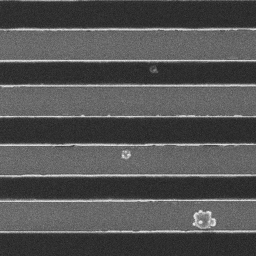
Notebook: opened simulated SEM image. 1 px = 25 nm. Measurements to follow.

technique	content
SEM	lines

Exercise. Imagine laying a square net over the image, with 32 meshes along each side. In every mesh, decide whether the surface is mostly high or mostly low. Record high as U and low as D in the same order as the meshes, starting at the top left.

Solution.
UUUUUUUUUUUUUUUUUUUUUUUUUUUUUUUU
UUUUUUUUUUUUUUUUUUUUUUUUUUUUUUUU
UUUUUUUUUUUUUUUUUUUUUUUUUUUUUUUU
UUUUUUUUUUUUUUUUUUUUUUUUUUUUUUUU
DDDDDDDDDDDDDDDDDDDDDDDDDDDDDDDD
DDDDDDDDDDDDDDDDDDDDDDDDDDDDDDDD
DDDDDDDDDDDDDDDDDDDDDDDDDDDDDDDD
DDDDDDDDDDDDDDDDDDDDDDDDDDDDDDDD
UUUUUUUUUUUUUUUUUUUUUUUUUUUUUUUU
UUUUUUUUUUUUUUUUUUUUUUUUUUUUUUUU
UUUUUUUUUUUUUUUUUUUUUUUUUUUUUUUU
DDDDDDDDDDDDDDDDDDDDDDDDDDDDDDDD
DDDDDDDDDDDDDDDDDDDDDDDDDDDDDDDD
DDDDDDDDDDDDDDDDDDDDDDDDDDDDDDDD
DDDDDDDDDDDDDDDDDDDDDDDDDDDDDDDD
UUUUUUUUUUUUUUUUUUUUUUUUUUUUUUUU
UUUUUUUUUUUUUUUUUUUUUUUUUUUUUUUU
UUUUUUUUUUUUUUUUUUUUUUUUUUUUUUUU
DDDDDDDDDDDDDDDDDDDDDDDDDDDDDDDD
DDDDDDDDDDDDDDDDDDDDDDDDDDDDDDDD
DDDDDDDDDDDDDDDDDDDDDDDDDDDDDDDD
DDDDDDDDDDDDDDDDDDDDDDDDDDDDDDDD
UUUUUUUUUUUUUUUUUUUUUUUUUUUUUUUU
UUUUUUUUUUUUUUUUUUUUUUUUUUUUUUUU
UUUUUUUUUUUUUUUUUUUUUUUUUUUUUUUU
DDDDDDDDDDDDDDDDDDDDDDDDDDDDDDDD
DDDDDDDDDDDDDDDDDDDDDDDDDDDDDDDD
DDDDDDDDDDDDDDDDDDDDDDDDDUDDDDDD
DDDDDDDDDDDDDDDDDDDDDDDDDDDDDDDD
UUUUUUUUUUUUUUUUUUUUUUUUUUUUUUUU
UUUUUUUUUUUUUUUUUUUUUUUUUUUUUUUU
UUUUUUUUUUUUUUUUUUUUUUUUUUUUUUUU